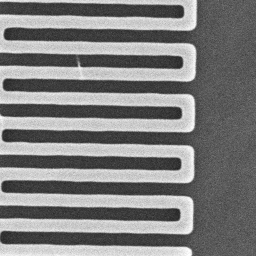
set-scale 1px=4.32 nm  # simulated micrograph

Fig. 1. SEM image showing groups of lines, slits or small figures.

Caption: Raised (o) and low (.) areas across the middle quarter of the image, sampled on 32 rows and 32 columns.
..............................oo
oooooooooooooooooooooooooooooooo
oooooooooooooooooooooooooooooooo
oooooooooooooooooooooooooooooooo
................................
................................
................................
oooooooooooooooooooooooo........
oooooooooooooooooooooooooooooooo
oooooooooooooooooooooooooooooooo
.....................ooooooooooo
.............................ooo
..............................oo
.............................ooo
oooooooooooooooooooooooooooooooo
oooooooooooooooooooooooooooooooo
oooooooooooooooooooooooooooooooo
................................
................................
................................
ooooooooooooooooooooooooooooo...
oooooooooooooooooooooooooooooooo
oooooooooooooooooooooooooooooooo
.............................ooo
.............................ooo
.............................ooo
oooooooooooo.................ooo
oooooooooooooooooooooooooooooooo
oooooooooooooooooooooooooooooooo
........................ooooooo.
................................
................................